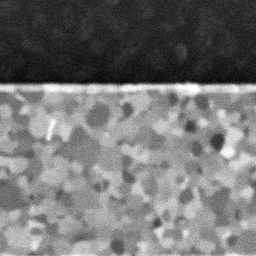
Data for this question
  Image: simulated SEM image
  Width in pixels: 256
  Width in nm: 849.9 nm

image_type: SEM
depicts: one or a few lines or trenches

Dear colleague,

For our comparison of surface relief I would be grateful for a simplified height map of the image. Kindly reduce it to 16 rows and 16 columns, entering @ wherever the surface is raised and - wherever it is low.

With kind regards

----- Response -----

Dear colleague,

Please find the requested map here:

----------------
----------------
----------------
----------------
----------------
@@@@@@@@@@@@@@@@
@@@@@@@@@@@@@@@@
@@@@@@@@@@@@@@@@
@@@@@@@@@@@@@@@@
@@@@@@@@@@@@@@@@
@@@@@@@@@@@@@@@@
@@@@@@@@@@@@@@@@
@@@@@@@@@@@@@@@@
@@@@@@@@@@@@@@@@
@@@@@@@@@@@@@@@@
@@@@@@@@@@@@@@@@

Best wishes